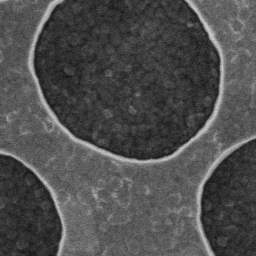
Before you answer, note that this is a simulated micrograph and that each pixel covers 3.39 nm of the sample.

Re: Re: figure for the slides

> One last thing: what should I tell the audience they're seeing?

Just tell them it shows holes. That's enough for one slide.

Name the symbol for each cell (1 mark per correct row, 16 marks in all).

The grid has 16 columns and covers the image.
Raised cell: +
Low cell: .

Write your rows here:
+++.........++++
+++..........+++
++...........+++
++............++
++............++
+++...........++
+++...........++
++++.........+++
+++++.......++++
+++++++....+++..
..+++++++++++...
...++++++++++...
...++++++++++...
....++++++++....
....+++++++++...
....+++++++++...